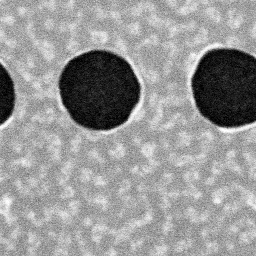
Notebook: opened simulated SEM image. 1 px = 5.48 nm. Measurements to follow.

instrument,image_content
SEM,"holes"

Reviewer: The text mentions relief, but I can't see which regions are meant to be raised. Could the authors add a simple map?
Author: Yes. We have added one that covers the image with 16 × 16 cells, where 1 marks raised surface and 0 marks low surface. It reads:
1111111111111111
1111111111111111
1111111111111111
1111100111111000
1111000011110000
0111000001110000
0111000001110000
1111100011111000
1111111111111111
1111111111111111
1111111111111111
1111111111111111
1111111111111111
1111111111111111
1111111111111111
1111111111111111